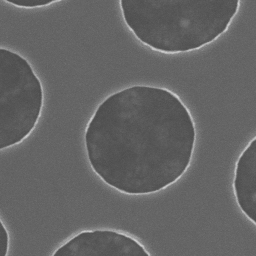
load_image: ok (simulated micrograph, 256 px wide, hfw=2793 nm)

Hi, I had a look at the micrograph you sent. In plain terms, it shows holes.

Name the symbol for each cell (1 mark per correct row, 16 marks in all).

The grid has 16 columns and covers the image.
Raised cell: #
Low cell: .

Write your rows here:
########.......#
########......##
#########....###
.###############
..##############
...#####..######
...###.....#####
..####......####
..###.......####
#####.......###.
######......###.
#######....####.
###############.
################
######.#########
####.....#######